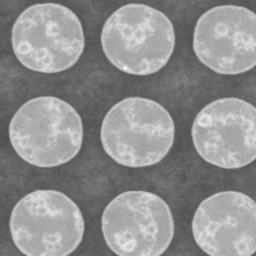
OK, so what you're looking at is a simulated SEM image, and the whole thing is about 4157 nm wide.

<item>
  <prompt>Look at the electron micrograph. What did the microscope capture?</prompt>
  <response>raised bodies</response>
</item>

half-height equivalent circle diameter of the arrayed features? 1.16 microns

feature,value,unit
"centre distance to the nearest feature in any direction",1.47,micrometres